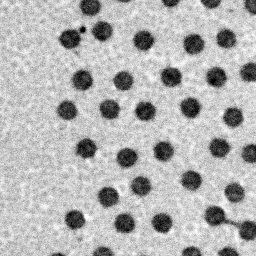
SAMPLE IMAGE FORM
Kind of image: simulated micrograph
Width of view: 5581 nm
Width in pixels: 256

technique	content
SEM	a regular array of raised bodies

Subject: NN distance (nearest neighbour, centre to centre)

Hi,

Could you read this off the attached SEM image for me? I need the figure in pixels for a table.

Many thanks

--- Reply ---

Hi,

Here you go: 34.2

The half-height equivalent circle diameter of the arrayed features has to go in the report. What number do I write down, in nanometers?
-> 452